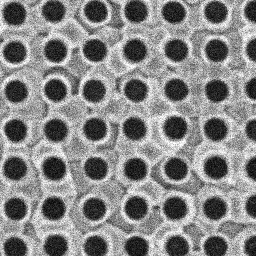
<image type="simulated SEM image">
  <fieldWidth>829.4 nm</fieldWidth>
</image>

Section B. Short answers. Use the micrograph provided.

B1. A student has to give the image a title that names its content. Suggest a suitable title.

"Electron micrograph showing a regular array of holes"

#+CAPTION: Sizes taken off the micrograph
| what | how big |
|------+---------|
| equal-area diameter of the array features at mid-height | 23.7 pixels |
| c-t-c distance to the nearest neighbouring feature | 0.124 µm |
